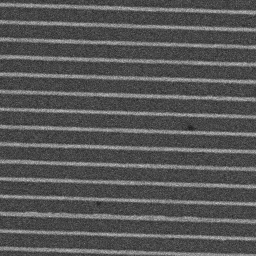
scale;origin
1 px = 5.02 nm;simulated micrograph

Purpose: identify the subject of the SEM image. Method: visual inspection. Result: parallel lines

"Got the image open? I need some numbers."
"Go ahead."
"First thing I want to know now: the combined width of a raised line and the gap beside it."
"17.4 pixels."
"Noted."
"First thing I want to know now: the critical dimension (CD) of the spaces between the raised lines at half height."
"70.8 nm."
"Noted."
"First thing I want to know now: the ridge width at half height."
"14.4 nanometres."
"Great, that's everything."